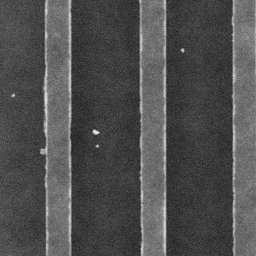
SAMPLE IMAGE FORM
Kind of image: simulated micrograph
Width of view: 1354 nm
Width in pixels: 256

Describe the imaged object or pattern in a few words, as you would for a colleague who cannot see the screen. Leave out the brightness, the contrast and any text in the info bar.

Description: lines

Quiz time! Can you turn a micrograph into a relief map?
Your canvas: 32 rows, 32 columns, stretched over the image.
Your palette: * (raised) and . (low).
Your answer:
......***.........***........***
......***.........***........***
......***.........***........***
......***.........***........***
......***.........***........***
......***.........***........***
......***.........***........***
......***.........***........***
......***.........***........***
......***.........***........***
......***.........***........***
......***.........***........***
......***.........***........***
......***.........***........***
......***.........***........***
......***.........***........***
......***.........***........***
......***.........***........***
......***.........***........***
......***.........***........***
......***.........***........***
......***.........***........***
......***.........***........***
......***.........***........***
......***.........***........***
......***.........***........***
......***.........***........***
......***.........***........***
......***.........***........***
......***.........***........***
......***.........***........***
......***.........***........***